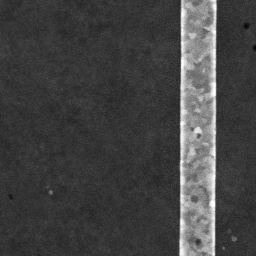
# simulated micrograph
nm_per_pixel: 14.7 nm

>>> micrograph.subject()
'wiring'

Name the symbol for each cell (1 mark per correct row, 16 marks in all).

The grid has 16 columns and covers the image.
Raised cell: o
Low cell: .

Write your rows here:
...........oo...
...........oo...
...........oo...
...........oo...
...........oo...
...........oo...
...........oo...
...........oo...
...........oo...
...........oo...
...........oo...
...........oo...
...........oo...
...........oo...
...........oo...
...........oo...